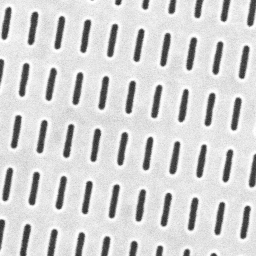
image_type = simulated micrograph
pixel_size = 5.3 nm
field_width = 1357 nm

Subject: a regular array of holes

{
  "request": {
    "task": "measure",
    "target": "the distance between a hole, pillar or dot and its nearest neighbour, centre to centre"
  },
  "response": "139 nanometers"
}